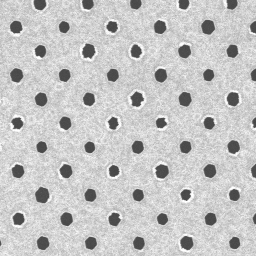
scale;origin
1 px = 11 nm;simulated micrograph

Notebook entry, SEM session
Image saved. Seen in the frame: a regular array of holes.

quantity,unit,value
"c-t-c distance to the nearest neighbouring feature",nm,370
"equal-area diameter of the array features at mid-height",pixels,12.5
